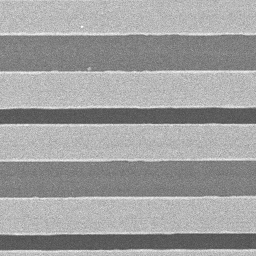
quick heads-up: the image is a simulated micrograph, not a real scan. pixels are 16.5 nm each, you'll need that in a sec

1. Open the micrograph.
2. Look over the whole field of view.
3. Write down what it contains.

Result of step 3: lines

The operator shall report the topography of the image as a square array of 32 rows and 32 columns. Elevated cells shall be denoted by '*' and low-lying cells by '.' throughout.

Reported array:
********************************
********************************
********************************
********************************
................................
................................
................................
................................
................................
********************************
********************************
********************************
********************************
***********......*..............
................................
..........................**....
********************************
********************************
********************************
********************************
................................
................................
................................
................................
................................
********************************
********************************
********************************
********************************
................................
................................
********************************